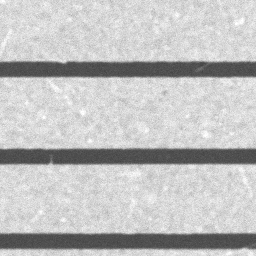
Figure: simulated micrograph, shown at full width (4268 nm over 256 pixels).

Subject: lines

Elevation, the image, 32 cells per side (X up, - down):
XXXXXXXXXXXXXXXXXXXXXXXXXXXXXXXX
XXXXXXXXXXXXXXXXXXXXXXXXXXXXXXXX
XXXXXXXXXXXXXXXXXXXXXXXXXXXXXXXX
XXXXXXXXXXXXXXXXXXXXXXXXXXXXXXXX
XXXXXXXXXXXXXXXXXXXXXXXXXXXXXXXX
XXXXXXXXXXXXXXXXXXXXXXXXXXXXXXXX
XXXXXXXXXXXXXXXXXXXXXXXXXXXXXXXX
XXXXXXXXXXXXXXXXXXXXXXXXXXXXXXXX
--------------------------------
--------------------------------
XXXXXXXXXXXXXXXXXXXXXXXXXXXXXXXX
XXXXXXXXXXXXXXXXXXXXXXXXXXXXXXXX
XXXXXXXXXXXXXXXXXXXXXXXXXXXXXXXX
XXXXXXXXXXXXXXXXXXXXXXXXXXXXXXXX
XXXXXXXXXXXXXXXXXXXXXXXXXXXXXXXX
XXXXXXXXXXXXXXXXXXXXXXXXXXXXXXXX
XXXXXXXXXXXXXXXXXXXXXXXXXXXXXXXX
XXXXXXXXXXXXXXXXXXXXXXXXXXXXXXXX
XXXXXXXXXXXXXXXXXXXXXXXXXXXXXXXX
--------------------------------
------X-------------------------
XXXXXXXXXXXXXXXXXXXXXXXXXXXXXXXX
XXXXXXXXXXXXXXXXXXXXXXXXXXXXXXXX
XXXXXXXXXXXXXXXXXXXXXXXXXXXXXXXX
XXXXXXXXXXXXXXXXXXXXXXXXXXXXXXXX
XXXXXXXXXXXXXXXXXXXXXXXXXXXXXXXX
XXXXXXXXXXXXXXXXXXXXXXXXXXXXXXXX
XXXXXXXXXXXXXXXXXXXXXXXXXXXXXXXX
XXXXXXXXXXXXXXXXXXXXXXXXXXXXXXXX
--------------------------------
--------------------------------
XXXXXXXXXXXXXXXXXXXXXXXXXXXXXXXX